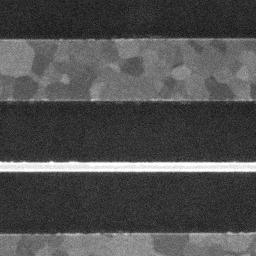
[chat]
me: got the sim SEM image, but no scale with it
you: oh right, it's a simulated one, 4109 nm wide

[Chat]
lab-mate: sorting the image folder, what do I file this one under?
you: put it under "lines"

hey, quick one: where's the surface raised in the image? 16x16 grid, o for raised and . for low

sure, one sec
................
................
...o.o.ooooooooo
oooooooooooooooo
oooooooooooooooo
oooooooooooooooo
................
................
................
................
................
................
................
................
................
oooooooooooooooo